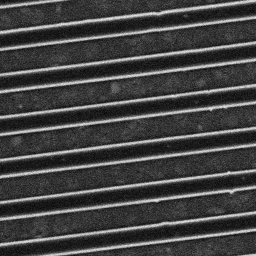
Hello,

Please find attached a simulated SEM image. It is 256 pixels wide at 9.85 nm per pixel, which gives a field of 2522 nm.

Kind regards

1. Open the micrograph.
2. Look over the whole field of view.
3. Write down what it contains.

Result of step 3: parallel lines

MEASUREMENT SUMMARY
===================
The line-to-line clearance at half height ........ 236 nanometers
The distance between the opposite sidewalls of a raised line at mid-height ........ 18.4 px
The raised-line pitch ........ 415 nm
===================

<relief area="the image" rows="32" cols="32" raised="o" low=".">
ooo.........................oooo
.....................ooooooooooo
............oooooooooooooooooo..
....oooooooooooooooooo..........
oooooooooooooo..................
oooooo........................oo
......................oooooooooo
..............oooooooooooooooooo
......ooooooooooooooooooo.......
ooooooooooooooooo...............
ooooooooo.......................
o........................ooooooo
.................ooooooooooooooo
.........oooooooooooooooooo.....
.ooooooooooooooooo..............
ooooooooooo.....................
ooo.........................oooo
...................ooooooooooooo
............ooooooooooooooooo...
....ooooooooooooooooo...........
ooooooooooooo...................
ooooo........................ooo
.....................ooooooooooo
.............ooooooooooooooooooo
......oooooooooooooooooo........
oooooooooooooooo................
oooooooo........................
........................oooooooo
................oooooooooooooooo
........ooooooooooooooooooo.....
ooooooooooooooooooo.............
ooooooooooo.....................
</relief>